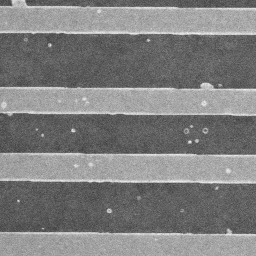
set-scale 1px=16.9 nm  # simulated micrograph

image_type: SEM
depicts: lines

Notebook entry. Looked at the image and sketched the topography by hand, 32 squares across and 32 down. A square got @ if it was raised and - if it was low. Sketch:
-@@-----------------------------
@@@@@@@@@@@@@@@@@@@@@@@@@@@@@@@@
@@@@@@@@@@@@@@@@@@@@@@@@@@@@@@@@
@@@@@@@@@@@@@@@@@@@@@@@@@@@@@@@@
--------------------------------
--------------------------------
--------------------------------
--------------------------------
--------------------------------
--------------------------------
--------------------------------
@@@@@@@@@@@@@@@@@@@@@@@@@@@@@@@@
@@@@@@@@@@@@@@@@@@@@@@@@@@@@@@@@
@@@@@@@@@@@@@@@@@@@@@@@@@@@@@@@@
--------------------------------
--------------------------------
--------------------------------
--------------------------------
--------------------------------
@@@@@@@@@@@@@@@@@@@@@@@@@@@@@@@@
@@@@@@@@@@@@@@@@@@@@@@@@@@@@@@@@
@@@@@@@@@@@@@@@@@@@@@@@@@@@@@@@@
@@@@@@@@@@@@@@@@@@@@@@@@@@@@@@@@
--------------------------------
--------------------------------
--------------------------------
--------------------------------
--------------------------------
--------------------------------
@@@@@@@@@@@@@@@@@@@@@@@@@@@@@@@@
@@@@@@@@@@@@@@@@@@@@@@@@@@@@@@@@
@@@@@@@@@@@@@@@@@@@@@@@@@@@@@@@@